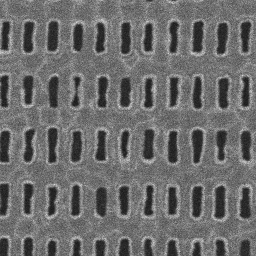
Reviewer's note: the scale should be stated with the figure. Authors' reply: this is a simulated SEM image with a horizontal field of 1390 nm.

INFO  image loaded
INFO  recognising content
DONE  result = a regular array of holes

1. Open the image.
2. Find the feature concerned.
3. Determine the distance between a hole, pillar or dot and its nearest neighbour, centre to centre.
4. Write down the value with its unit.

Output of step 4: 130 nm